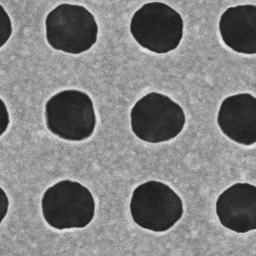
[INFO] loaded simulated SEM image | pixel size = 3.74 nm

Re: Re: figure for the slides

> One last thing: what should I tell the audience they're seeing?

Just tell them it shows holes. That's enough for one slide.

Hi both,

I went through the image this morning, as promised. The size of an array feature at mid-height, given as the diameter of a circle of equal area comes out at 0.193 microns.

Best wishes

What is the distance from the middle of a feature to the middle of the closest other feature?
86.2 px